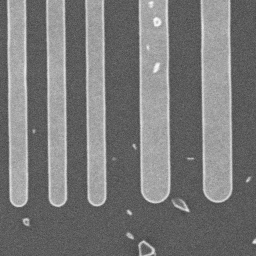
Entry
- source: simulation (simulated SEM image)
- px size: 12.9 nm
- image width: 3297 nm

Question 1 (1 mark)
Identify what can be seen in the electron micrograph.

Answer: groups of lines, slits or small figures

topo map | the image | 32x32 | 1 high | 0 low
01100011000110000011100001111000
01100011000110000011100001111000
01100011000110000011100001111000
01100011000110000011100001111000
01100011000110000011100001111000
01100011000110000011100001111000
01100011000110000011100001111000
01100011000110000011100001111000
01100011000110000011100001111000
01100011000110000011100001111000
01100011000110000011100001111000
01100011000110000011100001111000
01100011000110000011100001111000
01100011000110000011100001111000
01100011000110000011100001111000
01100011000110000011100001111000
01100011000110000011100001111000
01100011000110000011100001111000
01100011000110000011100001111000
01100011000110000011100000111000
01100011000110000011100001111000
01100011000110000011100000111000
01100011000110000011100000111000
01100011000110000011100000111000
01100011000110000011100000111000
00100001000010000000001000000000
00000000000000000000000000000000
00000000000000000000000000000000
00000000000000000000000000000000
00000000000000000000000000000000
00000000000000000000000000000000
00000000000000000010000000000000